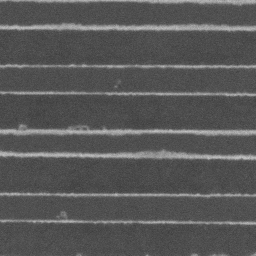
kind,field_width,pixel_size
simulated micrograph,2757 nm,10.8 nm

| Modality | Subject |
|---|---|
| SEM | lines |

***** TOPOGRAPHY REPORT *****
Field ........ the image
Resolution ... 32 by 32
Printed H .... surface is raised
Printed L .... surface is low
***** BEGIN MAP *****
HHHHHHHHHHHHHHHHHHHHHHHHHHHHHHHH
HHHHHHHHHHHHHHHHHHHHHHHHHHHHHHHH
HHHHHHHHHHHHHHHHHHHHHHHHHHHHHHHH
LLLLLLLLLLLLLLLHLHLHLLHLLLLLHHHH
LLLLLLLLLLLLLLLLLLLLLLLLLLLLLLLL
LLLLLLLLLLLLLLLLLLLLLLLLLLLLLLLL
LLLLLLLLLLLLLLLLLLLLLLLLLLLLLLLL
LLLLLLLLLLLLLLLLLLLLLLLLLLLLLLLL
HHHHHHHHHHHHHHHHHHHHHHHHHHHHHHHH
HHHHHHHHHHHHHHHHHHHHHHHHHHHHHHHH
HHHHHHHHHHHHHHHHHHHHHHHHHHHHHHHH
HHHHHHHHHHHHHHHHHHHHHHHHHHHHHHHH
LLLLLLLLLLLLLLLLLLLLLLLLLLLLLLLL
LLLLLLLLLLLLLLLLLLLLLLLLLLLLLLLL
LLLLLLLLLLLLLLLLLLLLLLLLLLLLLLLL
LLLLLLLLLLLLLLLLLLLLLLLLLLLLLLLL
HHHHHHHHHHHHHHHHHHHHHHHHHLLLLLHL
HHHHHHHHHHHHHHHHHHHHHHHHHHHHHHHH
HHHHHHHHHHHHHHHHHHHHHHHHHHHHHHHH
LLLLLLLLLLLLLHLLLLLLLLHHHHHHHHHH
LLLLLLLLLLLLLLLLLLLLLLLLLLLLLLLL
LLLLLLLLLLLLLLLLLLLLLLLLLLLLLLLL
LLLLLLLLLLLLLLLLLLLLLLLLLLLLLLLL
LLLLLLLLLLLLLLLLLLLLLLLLLLLLLLLL
HHHHHHHHHHHHHHHHHHHHHHHHHHHHHHHH
HHHHHHHHHHHHHHHHHHHHHHHHHHHHHHHH
HHHHHHHHHHHHHHHHHHHHHHHHHHHHHHHH
HHHHHHHHHHHHHHHHHHHHHHHHHHHHHHHH
LLLLLLLLLLLLLLLLLLLLLLLLLLLLLLLL
LLLLLLLLLLLLLLLLLLLLLLLLLLLLLLLL
LLLLLLLLLLLLLLLLLLLLLLLLLLLLLLLL
LLLLLLLLLLLLLLLLLLLLLLLLLLLLLLLL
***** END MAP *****